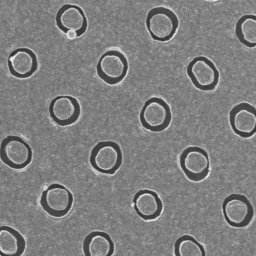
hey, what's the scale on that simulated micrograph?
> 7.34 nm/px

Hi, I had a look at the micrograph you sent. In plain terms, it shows a regular array of ring-shaped grooves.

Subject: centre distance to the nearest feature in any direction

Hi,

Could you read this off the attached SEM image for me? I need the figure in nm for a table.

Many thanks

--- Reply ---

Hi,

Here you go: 455